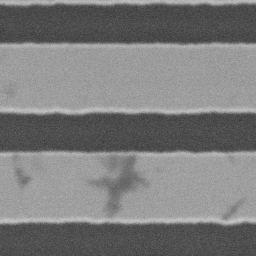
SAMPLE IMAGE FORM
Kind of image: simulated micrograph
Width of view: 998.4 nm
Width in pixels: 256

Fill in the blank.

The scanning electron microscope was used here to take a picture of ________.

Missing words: lines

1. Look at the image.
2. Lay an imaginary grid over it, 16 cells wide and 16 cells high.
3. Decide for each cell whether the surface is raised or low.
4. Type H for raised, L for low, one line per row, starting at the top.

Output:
LLLLLLLLLLLLLLLL
LLLLLLLLLLLLLLLL
LLLLLLLLLLLLLLLL
HHHHHHHHHHHHHHHH
HHHHHHHHHHHHHHHH
HHHHHHHHHHHHHHHH
HHHHHHHHHHHHHHHH
LLLLLLLLLLLLLLLL
LLLLLLLLLLLLLLLL
LLLLLLLLLLLLLLLL
HHHHHHHHHHHHHHHH
HHHHHHHHHHHHHHHH
HHHHHHHHHHHHHHHH
HHHHHHHHHHHHHHHH
LLLLLLLLLLLLLLLL
LLLLLLLLLLLLLLLL